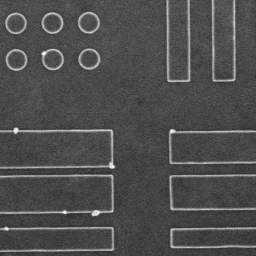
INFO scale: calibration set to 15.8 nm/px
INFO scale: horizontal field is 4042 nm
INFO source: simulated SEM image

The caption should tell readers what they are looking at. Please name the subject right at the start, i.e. groups of lines, slits or small figures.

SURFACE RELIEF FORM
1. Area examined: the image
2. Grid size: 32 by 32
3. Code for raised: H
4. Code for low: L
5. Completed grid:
LLLLLLLLLLLLLLLLLLLLLHHHLLLHHLLL
LLLLLLLLLLLLLLLLLLLLLHHHLLLHHLLL
LHHLLHHHLLHHLLLLLLLLLHHHLLLHHLLL
LHHLLLHHLLHHLLLLLLLLLHHHLLLHHLLL
LLLLLLLLLLLLLLLLLLLLLHHHLLLHHLLL
LLLLLLLLLLLLLLLLLLLLLHHHLLLHHLLL
LHHLLLHLLLHHLLLLLLLLLHHHLLLHHLLL
LHHLLHHHLLHHLLLLLLLLLHHHLLLHHLLL
LHHLLLHLLLLHLLLLLLLLLHHHLLLHHLLL
LLLLLLLLLLLLLLLLLLLLLHHHLLLHHLLL
LLLLLLLLLLLLLLLLLLLLLLLLLLLLLLLL
LLLLLLLLLLLLLLLLLLLLLLLLLLLLLLLL
LLLLLLLLLLLLLLLLLLLLLLLLLLLLLLLL
LLLLLLLLLLLLLLLLLLLLLLLLLLLLLLLL
LLLLLLLLLLLLLLLLLLLLLLLLLLLLLLLL
LLLLLLLLLLLLLLLLLLLLLLLLLLLLLLLL
HHHHHHHHHHHHHHLLLLLLLHLLLLHHHHHH
HHHHHHHHHHHHHHLLLLLLLHHHHHHHHHHH
HHHHHHHHHHHHHHLLLLLLLHHHHHHHHHHH
HHHHHHHHHHHHHHLLLLLLLHHHHHHHHHHH
HHHHHHHHHHHHHHLLLLLLLLLLLLLLLLLL
LLLLLLLLLLLLLLLLLLLLLLLLLLLLLLLL
HHHHHHHHHHHHHHLLLLLLLHHHHHHHHHHH
HHHHHHHHHHHHHHLLLLLLLHHHHHHHHHHH
HHHHHHHHHHHHHHLLLLLLLHHHHHHHHHHH
HHHHHHHHHHHHHHLLLLLLLHHHHHHHHHHH
HHHHHHHHHHHHHHLLLLLLLLLLLLLLLLLL
LLLLLLLLLLLLLLLLLLLLLLLLLLLLLLLL
HLLLLLLLHHHHHHLLLLLLLLLLLLLLLLLL
HHHHHHHHHHHHHHLLLLLLLHHHHHHHHHHH
HHHHHHHHHHHHHHLLLLLLLHHHHHHHHHHH
LLLLLLLLLLLLLLLLLLLLLLLLLLLLLLLL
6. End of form